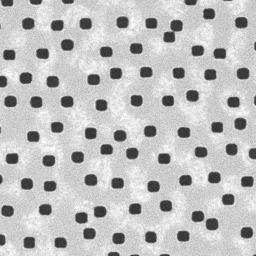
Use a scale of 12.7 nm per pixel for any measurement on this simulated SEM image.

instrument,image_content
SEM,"a regular array of holes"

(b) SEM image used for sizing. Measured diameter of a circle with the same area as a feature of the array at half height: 164 nanometres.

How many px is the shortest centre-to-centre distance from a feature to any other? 25.6